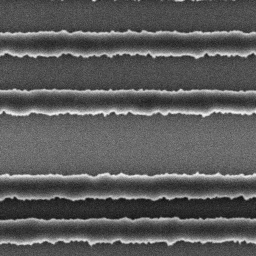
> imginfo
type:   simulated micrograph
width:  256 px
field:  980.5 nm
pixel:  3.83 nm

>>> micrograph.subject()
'lines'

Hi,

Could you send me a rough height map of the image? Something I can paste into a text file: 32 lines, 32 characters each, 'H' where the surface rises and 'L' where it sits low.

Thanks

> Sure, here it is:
LLLLLLLLLLLLLLLLLLLLLLLLLLLLLLLL
LLLLLLLLLLLLLLLLLLLLLLLLLLLLLLLL
LLLLLLLLLLLLLLLLLLLLLLLLLLLLLLLL
LLLLLLLLLLLLLLLLLLLLLLLLLLLLLLLL
HHHHHHHHHHHHHHHHHHHHHHHHHHHHHHHH
HHHHHHHHHHHHHHHHHHHHHHHHHHHHHHHH
HHHHHHHHHHHHHHHHHHHHHHHHHHHHHHHH
LLLLLLLLLLLLLLLLLLLLLLLLLLLLLLLL
LLLLLLLLLLLLLLLLLLLLLLLLLLLLLLLL
LLLLLLLLLLLLLLLLLLLLLLLLLLLLLLLL
LLLLLLLLLLLLLLLLLLLLLLLLLLLLLLLL
HHHHHHHHHHHHHHHHHHHHHHHHHHHHHHHH
HHHHHHHHHHHHHHHHHHHHHHHHHHHHHHHH
HHHHHHHHHHHHHHHHHHHHHHHHHHHHHHHH
LLLLLLLLLLLLLLLLLLLLLLLLLLLLLLLL
LLLLLLLLLLLLLLLLLLLLLLLLLLLLLLLL
LLLLLLLLLLLLLLLLLLLLLLLLLLLLLLLL
LLLLLLLLLLLLLLLLLLLLLLLLLLLLLLLL
LLLLLLLLLLLLLLLLLLLLLLLLLLLLLLLL
LLLLLLLLLLLLLLLLLLLLLLLLLLLLLLLL
LLLLLLLLLLLLLLLLLLLLLLLLLLLLLLLL
LLLLLLLLLLLLLLLLLLLLLLLLLLLLLLLL
HHHHHHHHHHHHHHHHHHHHHHHHHHHHHHHH
HHHHHHHHHHHHHHHHHHHHHHHHHHHHHHHH
HHHHHHHHHHHHHHHHHHHHHHHHHHHHHHHH
LLLLLLLLLLLLLLLLLLLLLLLLLLLLLLLL
LLLLLLLLLLLLLLLLLLLLLLLLLLLLLLLL
HHHHHHHHHHHHHHHHHHHHHHHHHHHHHHHH
HHHHHHHHHHHHHHHHHHHHHHHHHHHHHHHH
HHHHHHHHHHHHHHHHHHHHHHHHHHHHHHHH
LLHHLLLLLLLHLLLLLLLLLLLLLLLLLLLL
LLLLLLLLLLLLLLLLLLLLLLLLLLLLLLLL